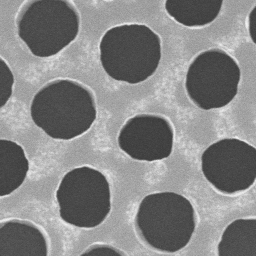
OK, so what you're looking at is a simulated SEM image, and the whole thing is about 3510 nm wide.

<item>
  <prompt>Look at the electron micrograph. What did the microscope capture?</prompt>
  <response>holes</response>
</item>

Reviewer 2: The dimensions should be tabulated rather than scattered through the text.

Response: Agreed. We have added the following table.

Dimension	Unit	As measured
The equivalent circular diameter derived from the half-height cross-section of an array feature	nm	815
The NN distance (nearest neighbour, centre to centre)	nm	1180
